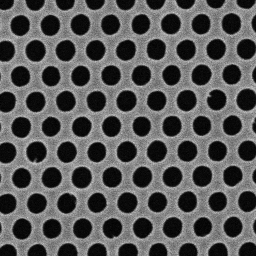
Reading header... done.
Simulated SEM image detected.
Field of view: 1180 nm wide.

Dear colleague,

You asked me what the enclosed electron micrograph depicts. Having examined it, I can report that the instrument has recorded a regular array of holes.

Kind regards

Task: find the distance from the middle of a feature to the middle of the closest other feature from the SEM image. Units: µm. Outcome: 0.135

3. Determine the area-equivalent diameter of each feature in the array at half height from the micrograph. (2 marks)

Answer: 0.093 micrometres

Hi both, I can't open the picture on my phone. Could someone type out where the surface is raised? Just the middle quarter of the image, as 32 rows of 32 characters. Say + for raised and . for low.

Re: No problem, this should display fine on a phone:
+++..++++++..++++++..+++++..++++
++....++++....+++....++++....+++
++.....++.....+++.....+++....+++
++....+++.....+++.....+++....+++
++....++++....+++....++++....+++
+++..+++++++++++++++++++++++++++
++++++++++++++++++++++++++++++.+
..++++....++++....+++....++++...
...+++....+++.....+++.....++....
...+++.....++.....+++.....++....
...+++....+++.....+++....+++....
..+++++...++++...+++++..+++++...
++++++++++++++++++++++++++++++++
+++...++++...+++++...+++++..++++
++.....+++....+++.....+++....+++
++.....++.....+++.....++.....+++
++.....+++....+++.....+++....+++
++....++++....++++...++++...++++
++++++++++++++++++++++++++++++++
.+++++++.++++++..+++++..++++++..
...+++....++++....+++....++++...
...+++.....++.....+++.....++....
...+++.....++.....+++.....++....
...+++....++++....+++....++++...
.++++++..++++++.++++++++++++++++
++++++++++++++++++++++++++++++++
+++...++++....++++...++++....+++
++.....+++....+++.....+++....+++
++.....++......++.....+++....+++
++.....+++....+++.....+++....+++
+++...++++...+++++...+++++..++++
++++++++++++++++++++++++++++++++